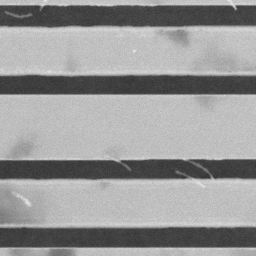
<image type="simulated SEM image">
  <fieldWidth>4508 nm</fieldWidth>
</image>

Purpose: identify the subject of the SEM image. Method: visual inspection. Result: lines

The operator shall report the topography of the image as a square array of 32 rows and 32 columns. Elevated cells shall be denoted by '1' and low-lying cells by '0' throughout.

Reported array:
11111111111111111111111111111111
00000000000000000000000000000000
00000000000000000000000000000000
11111001111111111111111111111111
11111111111111111111111111111111
11111111111111111111111111111111
11111111111111111111111111111111
11111111111111111111111111111111
11111111111111111111111111111111
00000000000000000000000000000000
00000000000000000000000000000000
00000000000000000000000000000000
11111111111111111111111111111111
11111111111111111111111111111111
11111111111111111111111111111111
11111111111111111111111111111111
11111111111111111111111111111111
11111111111111111111111111111111
11111111111111111111111111111111
11111111111111111111111111111111
00000000000000000000000000000000
00000000000000000000000000000000
11010011111011001111111111111111
11111111111111111111111111111111
11111111111111111111111111111111
11111111111111111111111111111111
11111111111111111111111111111111
11111111111111111111111111111111
00000000000000000000000000000000
00000000000000000000000000000000
00000000000000000000000000000000
11111111111111111111111111111111